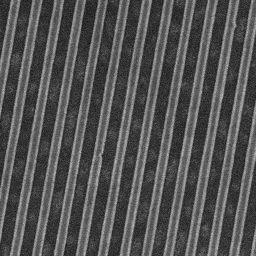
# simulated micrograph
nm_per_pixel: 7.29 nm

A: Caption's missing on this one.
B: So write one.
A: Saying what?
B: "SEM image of parallel lines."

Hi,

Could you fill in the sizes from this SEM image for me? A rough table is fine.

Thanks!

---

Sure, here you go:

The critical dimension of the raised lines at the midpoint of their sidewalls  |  7.15 px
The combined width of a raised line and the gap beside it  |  157 nm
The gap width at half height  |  105 nm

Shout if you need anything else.